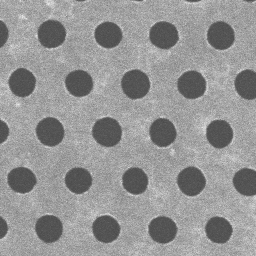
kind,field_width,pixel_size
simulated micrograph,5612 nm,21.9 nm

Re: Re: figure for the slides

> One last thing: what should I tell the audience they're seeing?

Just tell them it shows a regular array of holes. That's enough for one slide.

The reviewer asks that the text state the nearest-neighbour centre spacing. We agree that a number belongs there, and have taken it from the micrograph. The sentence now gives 1220 nanometers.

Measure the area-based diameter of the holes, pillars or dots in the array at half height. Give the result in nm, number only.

632